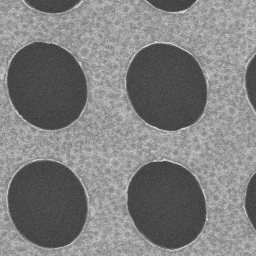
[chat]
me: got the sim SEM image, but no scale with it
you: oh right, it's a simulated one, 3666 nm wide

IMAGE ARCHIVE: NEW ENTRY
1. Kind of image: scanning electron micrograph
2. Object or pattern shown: holes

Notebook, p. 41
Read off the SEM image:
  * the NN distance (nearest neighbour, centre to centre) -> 118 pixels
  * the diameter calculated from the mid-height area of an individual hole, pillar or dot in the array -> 1200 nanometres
